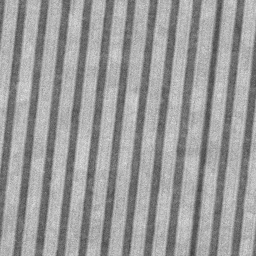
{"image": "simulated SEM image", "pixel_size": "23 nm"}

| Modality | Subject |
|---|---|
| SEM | parallel lines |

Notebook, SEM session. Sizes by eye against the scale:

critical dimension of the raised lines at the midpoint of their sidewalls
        263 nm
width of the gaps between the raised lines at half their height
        223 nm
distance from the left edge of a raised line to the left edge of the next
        21.7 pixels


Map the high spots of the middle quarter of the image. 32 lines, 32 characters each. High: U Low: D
UUUDDDUUDDDUUUDDDUUDDDUUUDDUUUDD
UUUDDUUUDDDUUUDDUUUDDDUUUDDUUUDD
UUUDDUUUDDDUUUDDUUUDDDUUUDDUUUDD
UUUDDUUUDDDUUUDDUUUDDDUUDDDUUUDD
UUUDDUUUDDDUUUDDUUUDDUUUDDDUUUDD
UUDDDUUUDDDUUDDDUUUDDUUUDDDUUUDD
UUDDDUUUDDUUUDDDUUUDDUUUDDDUUUDD
UUDDDUUUDDUUUDDDUUDDDUUUDDDUUDDD
UUDDDUUUDDUUUDDDUUDDDUUUDDUUUDDD
UUDDDUUUDDUUUDDDUUDDDUUUDDUUUDDD
UUDDUUUDDDUUUDDUUUDDDUUUDDUUUDDD
UUDDUUUDDDUUUDDUUUDDDUUUDDUUUDDD
UUDDUUUDDDUUUDDUUUDDDUUDDDUUUDDD
UUDDUUUDDDUUUDDUUUDDUUUDDDUUUDDD
UDDDUUUDDDUUDDDUUUDDUUUDDDUUUDDD
UDDDUUUDDUUUDDDUUUDDUUUDDDUUUDDU
UDDDUUUDDUUUDDDUUUDDUUUDDDUUDDDU
UDDDUUUDDUUUDDDUUDDDUUUDDUUUDDDU
UDDDUUUDDUUUDDDUUDDDUUUDDUUUDDDU
UDDDUUDDDUUUDDUUUDDDUUDDDUUUDDDU
UDDUUUDDDUUUDDUUUDDDUUUDDUUUDDDU
UDDUUUDDDUUDDDUUUDDDUUDDDUUUDDDU
UDDUUUDDDUUDDDUUUDDUUUDDDUUUDDDU
DDDUUUDDDUUDDDUUUDDUUUDDDUUUDDDU
DDDUUUDDUUUDDDUUUDDUUUDDDUUUDDUU
DDDUUUDDUUUDDDUUUDDUUUDDDUUUDDUU
DDDUUUDDUUUDDDUUDDDUUUDDUUUDDDUU
DDDUUUDDUUUDDDUUDDDUUUDDUUUDDDUU
DDDUUDDDUUUDDDUUDDDUUUDDUUUDDDUU
DDUUUDDDUUUDDUUUDDDUUUDDUUUDDDUU
DDUUUDDDUUDDDUUUDDDUUDDDUUUDDDUU
DDUUUDDDUUDDDUUUDDUUUDDDUUUDDDUU